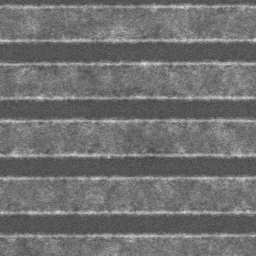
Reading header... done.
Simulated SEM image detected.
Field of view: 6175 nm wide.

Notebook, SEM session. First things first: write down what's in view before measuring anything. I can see parallel lines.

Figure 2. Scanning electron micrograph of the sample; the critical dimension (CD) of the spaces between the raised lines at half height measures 555 nm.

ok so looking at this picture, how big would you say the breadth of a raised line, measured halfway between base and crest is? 832 nanometers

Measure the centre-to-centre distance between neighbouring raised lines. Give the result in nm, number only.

1380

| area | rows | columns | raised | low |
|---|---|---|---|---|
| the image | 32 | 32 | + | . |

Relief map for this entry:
................................
++++++++++++++++++++++++++++++++
++++++++++++++++++++++++++++++++
++++++++++++++++++++++++++++++++
++++++++++++++++++++++++++++++++
................................
................................
................................
++++++++++++++++++++++++++++++++
++++++++++++++++++++++++++++++++
++++++++++++++++++++++++++++++++
++++++++++++++++++++++++++++++++
................................
................................
................................
++++++++++++++++++++++++++++++++
++++++++++++++++++++++++++++++++
++++++++++++++++++++++++++++++++
++++++++++++++++++++++++++++++++
.............+..................
................................
................................
++++++++++++++++++++++++++++++++
++++++++++++++++++++++++++++++++
++++++++++++++++++++++++++++++++
++++++++++++++++++++++++++++++++
++++++++++++++++++++++++++++++++
................................
................................
+.+++++++++++++++++++++.++++++++
++++++++++++++++++++++++++++++++
++++++++++++++++++++++++++++++++